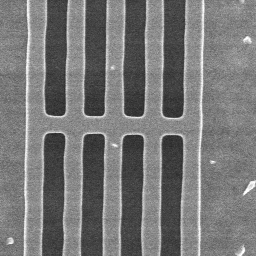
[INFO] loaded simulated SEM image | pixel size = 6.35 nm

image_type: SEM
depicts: groups of lines, slits or small figures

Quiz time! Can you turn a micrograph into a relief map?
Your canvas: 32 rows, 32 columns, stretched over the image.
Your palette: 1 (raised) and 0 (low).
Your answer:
00011100011001110011000110000000
00011100111001110011000110000000
00011100111001110011000110000000
00001100111001110011000110000000
00001100111001110011000110000000
00011100111001100011000110000000
00011100111001100011000110000000
00011100111001100011000110000000
00011100111001100011000110000000
00011100111001100011000110000000
00011100110001100011000110000000
00011100110001100011000110000000
00011100110001100011000110000000
00011100110001100011000110000000
00011111111011110111100110000000
00011111111111111111111110000000
00011111111111111111111110000000
00011100110001100011000110000000
00011000110001100011000110000000
00011000110001100011000110000000
00011000110001100011000110000000
00011000110001100011000110000000
00011000110001100011000110000000
00011000110001100011000110000000
00011000110001100011000110000000
00011000110001100011000110000000
00011000110001100011000110000000
00011000110001100011000110000000
00011000110001100011000110000000
00011000110001100011000110000000
00011000110001100011000110000000
00011000110001100011000110000000